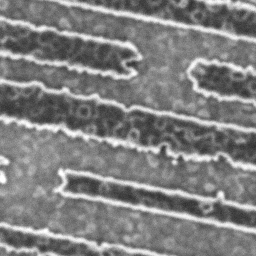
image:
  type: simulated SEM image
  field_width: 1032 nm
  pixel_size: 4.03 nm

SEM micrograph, one or a few lines or trenches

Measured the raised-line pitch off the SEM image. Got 0.265 um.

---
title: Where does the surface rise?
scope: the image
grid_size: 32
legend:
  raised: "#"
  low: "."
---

.........#####################..
..............##################
#..................#############
#####...................########
##########...................###
###############.................
#################...............
....#############...............
.........#######........######..
..............##........########
##..#...................########
#########................#######
#############.................##
################.#..............
######################..........
...########################.....
........########################
............####################
.................###.###########
.......................#########
.............................###
........#.......................
........######..................
........###########.............
.........###############...#....
...............##############...
....................############
.........................#######
##............................##
########........................
############....................
.....#############..............